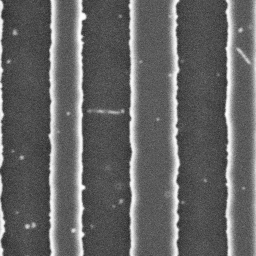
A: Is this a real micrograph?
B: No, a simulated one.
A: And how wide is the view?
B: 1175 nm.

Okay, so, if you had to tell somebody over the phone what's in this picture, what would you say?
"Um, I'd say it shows lines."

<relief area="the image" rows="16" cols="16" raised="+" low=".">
...++...+++...++
...++...+++...++
...++...+++...++
...++...+++...++
...++...+++...++
...++...+++...++
...++...+++...++
...++...+++...++
...++...+++...++
...++...+++...++
...++...+++...++
...++...+++...++
...++...+++...++
...++...+++...++
...++...+++...++
...++...+++...++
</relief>